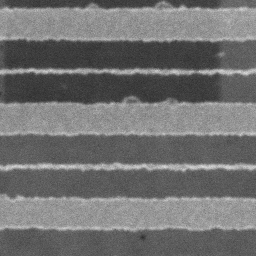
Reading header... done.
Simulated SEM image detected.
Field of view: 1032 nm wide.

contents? lines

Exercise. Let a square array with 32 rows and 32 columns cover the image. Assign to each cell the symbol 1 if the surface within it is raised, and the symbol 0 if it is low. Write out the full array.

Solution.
00000000000000000000100000000000
11111111111111111111111111111111
11111111111111111111111111111111
11111111111111111111111111111111
11111111111111111111111111111111
00000000000000000000000000000000
00000000000000000000000000000000
00000000000000000000000000000000
00000000000000000000000000000000
00000000000000000000000000000000
00000000000000000000000000000000
00000000000000000000000000000000
00000000000000001000010000000000
11111111111111111111111111111111
11111111111111111111111111111111
11111111111111111111111111111111
11111111111111111111111111111111
00000000000000000000000000000000
00000000000000000000000000000000
00000000000000000000000000000000
00000000000000100000000000000000
00000000000000000000000000000000
00000000000000000000000000000000
00000000000000000000000000000000
10000000000000000000000000000000
11111111111111111111111111111111
11111111111111111111111111111111
11111111111111111111111111111111
00000101111111111111100111001110
00000000000000000000000000000000
00000000000000000000000000000000
00000000000000000000000000000000